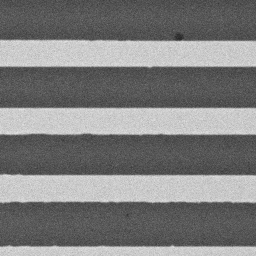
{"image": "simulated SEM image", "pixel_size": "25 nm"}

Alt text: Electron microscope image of lines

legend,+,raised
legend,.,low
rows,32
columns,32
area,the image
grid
................................
................................
................................
................................
................................
++++++++++++++++++++++++++++++++
++++++++++++++++++++++++++++++++
++++++++++++++++++++++++++++++++
................................
................................
................................
................................
................................
................................
++++++++++++++++++++++++++++++++
++++++++++++++++++++++++++++++++
++++++++++++++++++++++++++++++++
................................
................................
................................
................................
................................
++++++++++++++++++++++++++++++++
++++++++++++++++++++++++++++++++
++++++++++++++++++++++++++++++++
................................
................................
................................
................................
................................
................................
++++++++++++++++++++++++++++++++